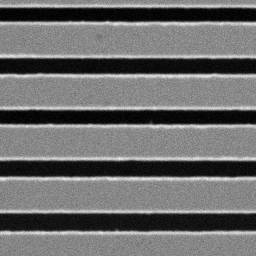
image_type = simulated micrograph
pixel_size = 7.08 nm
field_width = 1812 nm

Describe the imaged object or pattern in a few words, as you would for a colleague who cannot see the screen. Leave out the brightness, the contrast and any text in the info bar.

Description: lines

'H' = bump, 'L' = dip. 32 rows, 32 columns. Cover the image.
HHHHHHHHHHHHHHHHHHHHHHHHHHHHHHHH
LLLLLLLLLLLLLLLLLLLLLLLLLLLLLLLL
LLLLLLLLLLLLLLLLLLLLLLLLLLLLLLLL
HHHHHHHHHHHHHHHHHHHHHHHHHHHHHHHH
HHHHHHHHHHHHHHHHHHHHHHHHHHHHHHHH
HHHHHHHHHHHHHHHHHHHHHHHHHHHHHHHH
HHHHHHHHHHHHHHHHHHHHHHHHHHHHHHHH
LLLLLLLLLLLLLLLLLLLLLLLLLLLLLLLL
LLLLLLLLLLLLLLLLLLLLLLLLLLLLLLLL
HHHHHHHHHHHHHHHHHHHHHHHHHHHHHHHH
HHHHHHHHHHHHHHHHHHHHHHHHHHHHHHHH
HHHHHHHHHHHHHHHHHHHHHHHHHHHHHHHH
HHHHHHHHHHHHHHHHHHHHHHHHHHHHHHHH
HHHHHHHHHHHHHHHHHHHHHHHHHHHHHHHH
LLLLLLLLLLLLLLLLLLLLLLLLLLLLLLLL
LLLLLLLLLLLLLLLLLLLLLLLLLLLLLLLL
HHHHHHHHHHHHHHHHHHHHHHHHHHHHHHHH
HHHHHHHHHHHHHHHHHHHHHHHHHHHHHHHH
HHHHHHHHHHHHHHHHHHHHHHHHHHHHHHHH
HHHHHHHHHHHHHHHHHHHHHHHHHHHHHHHH
LLLLLLLLLLLLLLLLLLLLLLLLLLLLLLLL
LLLLLLLLLLLLLLLLLLLLLLLLLLLLLLLL
HHHHHHHHHHHHHHHHHHHHHHHHHHHHHHHH
HHHHHHHHHHHHHHHHHHHHHHHHHHHHHHHH
HHHHHHHHHHHHHHHHHHHHHHHHHHHHHHHH
HHHHHHHHHHHHHHHHHHHHHHHHHHHHHHHH
HHHHHHHHHHHHHHHHHHHHHHHHHHHHHHHH
LLLLLLLLLLLLLLLLLLLLLLLLLLLLLLLL
LLLLLLLLLLLLLLLLLLLLLLLLLLLLLLLL
HHHHHHHHHHHHHHHHHHHHHHHHHHHHHHHH
HHHHHHHHHHHHHHHHHHHHHHHHHHHHHHHH
HHHHHHHHHHHHHHHHHHHHHHHHHHHHHHHH